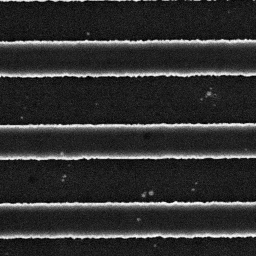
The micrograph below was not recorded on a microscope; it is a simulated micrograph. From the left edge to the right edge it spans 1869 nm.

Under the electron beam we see lines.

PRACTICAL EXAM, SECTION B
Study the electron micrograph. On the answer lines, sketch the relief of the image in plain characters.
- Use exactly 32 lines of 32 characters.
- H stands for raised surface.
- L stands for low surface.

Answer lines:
LLLLLLLLLLLLLLLLLLLLLLLLLLLLLLLL
LLLLLLLLLLLLLLLLLLLLLLLLLLLLLLLL
LLLLLLLLLLLLLLLLLLLLLLLLLLLLLLLL
LLLLLLLLLLLLLLLLLLLLLLLLLLLLLLLL
LLLLLLLLLLLLLLLLLLLLLLLLLLLLLLLL
HHHHHHHHHHHHHHHHHHHHHHHHHHHHHHHH
HHHHHHHHHHHHHHHHHHHHHHHHHHHHHHHH
HHHHHHHHHHHHHHHHHHHHHHHHHHHHHHHH
HHHHHHHHHHHHHHHHHHHHHHHHHHHHHHHH
HLHHHHLLLLHLLLLLLLLLLLLLLLLLLLLL
LLLLLLLLLLLLLLLLLLLLLLLLLLLLLLLL
LLLLLLLLLLLLLLLLLLLLLLLLLLLLLLLL
LLLLLLLLLLLLLLLLLLLLLLLLLLLLLLLL
LLLLLLLLLLLLLLLLLLLLLLLLLLLLLLLL
LLLLLLLLLLLLLLLLLLLLLLLLLLLLLLLL
LLLLLLLLLLLLLLLLLLLLLLLLLLLLLHHH
HHHHHHHHHHHHHHHHHHHHHHHHHHHHHHHH
HHHHHHHHHHHHHHHHHHHHHHHHHHHHHHHH
HHHHHHHHHHHHHHHHHHHHHHHHHHHHHHHH
HHHHHHHHHHHHHHHHHHHHHHHHHHHHHHHH
LLLLLLLLLLLLLLLLLLLLLLLLLLLLLLLL
LLLLLLLLLLLLLLLLLLLLLLLLLLLLLLLL
LLLLLLLLLLLLLLLLLLLLLLLLLLLLLLLL
LLLLLLLLLLLLLLLLLLLLLLLLLLLLLLLL
LLLLLLLLLLLLLLLLLLLLLLLLLLLLLLLL
LLLHHHHHHHHHHHHHHHHHHHHHHHHHHHHH
HHHHHHHHHHHHHHHHHHHHHHHHHHHHHHHH
HHHHHHHHHHHHHHHHHHHHHHHHHHHHHHHH
HHHHHHHHHHHHHHHHHHHHHHHHHHHHHHHH
HHHHHHHHHHHHHHHHHHHHHHHHHHHHHHHH
LLLLLLLLLLLLLLLLLLLLLLLLLLLLLLLL
LLLLLLLLLLLLLLLLLLLLLLLLLLLLLLLL